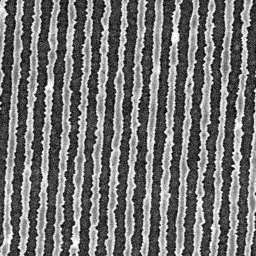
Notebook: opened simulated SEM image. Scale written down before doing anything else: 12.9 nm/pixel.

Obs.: parallel lines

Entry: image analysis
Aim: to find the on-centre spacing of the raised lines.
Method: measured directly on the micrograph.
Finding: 225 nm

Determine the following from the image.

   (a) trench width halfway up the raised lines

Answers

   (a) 10.2 px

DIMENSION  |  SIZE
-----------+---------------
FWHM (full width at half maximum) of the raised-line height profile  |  93.4 nanometers